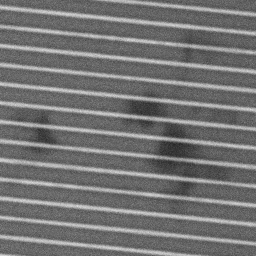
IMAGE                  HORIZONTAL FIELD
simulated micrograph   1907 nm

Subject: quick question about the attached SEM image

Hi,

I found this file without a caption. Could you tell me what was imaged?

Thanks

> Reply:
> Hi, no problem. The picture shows parallel lines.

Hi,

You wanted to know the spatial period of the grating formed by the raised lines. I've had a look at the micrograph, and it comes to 142 nm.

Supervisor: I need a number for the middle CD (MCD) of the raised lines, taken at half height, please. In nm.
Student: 20.4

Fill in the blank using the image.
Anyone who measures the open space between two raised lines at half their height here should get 0.125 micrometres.